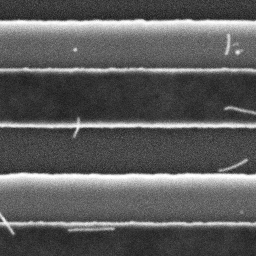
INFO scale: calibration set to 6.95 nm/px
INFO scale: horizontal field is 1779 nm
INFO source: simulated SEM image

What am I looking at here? lines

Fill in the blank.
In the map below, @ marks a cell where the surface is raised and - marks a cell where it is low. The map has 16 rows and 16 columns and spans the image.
----------------
@@@@@@@@@@@@@@@@
@@@@@@@@@@@@@@@@
@@@@@@@@@@@@@@@@
@@@@@@@@@@@@@@@@
@@@@@@@@@@@@@@@@
@@@@@@@@@@@@@@@@
@@@@@@@@@@@@@@@@
----------------
----------------
----------------
@@@@@@@@@@@@@@@@
@@@@@@@@@@@@@@@@
@@@@@@@@@@@@@@@@
@@@@@@@@@@@@@@@@
@@@@@@@@@@@@@@@@